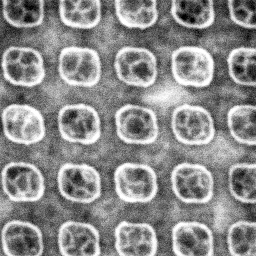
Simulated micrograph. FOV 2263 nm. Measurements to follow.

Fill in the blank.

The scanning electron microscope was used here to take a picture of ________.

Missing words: a regular array of raised bodies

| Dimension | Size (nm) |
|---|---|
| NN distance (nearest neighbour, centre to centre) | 499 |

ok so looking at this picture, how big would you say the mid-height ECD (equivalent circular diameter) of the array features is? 341 nanometers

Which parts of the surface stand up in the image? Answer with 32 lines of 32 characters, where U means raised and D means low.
DUUUUDDDUUUUDDDUUUUDDDUUUUDDDUUU
DUUUUDDDUUUUDDDUUUUDDDUUUUDDDUUU
DUUUUDDDUUUUDDDUUUUDDDUUUUDDDUUU
DDDDDDDDDDDDDDDDDDDDDDDDDDDDDDDD
DDDDDDDDDDDDDDDDDDDDDDDDDDDDDDDD
DDDDDDDDDDDDDDDDDDDDDDDDDDDDDDDD
DUUUDDDDUUUDDDDUUUDDDDUUUDDDDUUU
DUUUUDDDUUUUDDDUUUUDDDUUUUDDDUUU
DUUUUDDDUUUUDDDUUUUDDDUUUUDDDUUU
DUUUUDDDUUUUDDDUUUUDDDUUUUDDDUUU
DDDDDDDDDDUDDDDDDUUDDDDDUUDDDDDD
DDDDDDDDDDDDDDDDDDDDDDDDDDDDDDDD
DDDDDDDDDDDDDDDDDDDDDDDDDDDDDDDD
DUUUDDDDDUUDDDDDUDDDDDDDDDDDDDUU
DUUUUDDDUUUUDDDUUUUDDDUUUUDDDUUU
DUUUUDDDUUUUDDDUUUUDDDUUUUDDDUUU
DUUUUDDDUUUUDDDUUUUDDDUUUUUDDUUU
DDUUUDDDDUUUDDDDUUUDDDDUUUDDDDUU
DDDDDDDDDDDDDDDDDDDDDDDDDDDDDDDD
DDDDDDDDDDDDDDDDDDDDDDDDDDDDDDDD
DDDDDDDDDDDDDDDDDDDDDDDDDDDDDDDD
UUUUUDDDUUUUDDDUUUUDDDUUUUDDDUUU
UUUUUDDUUUUUDDDUUUUDDDUUUUDDDUUU
DUUUUDDDUUUUDDDUUUUDDDUUUUDDDUUU
DUUUUDDDUUUUDDDUUUUDDDUUUUDDDUUU
DDDDDDDDDDDDDDDDDDDDDDDDDDDDDDDD
DDDDDDDDDDDDDDDDDDDDDDDDDDDDDDDD
DDDDDDDDDDDDDDDDDDDDDDDDDDDDDDDD
DUUUDDDDUUUDDDDUUUUDDDUUUUDDDUUU
UUUUUDDDUUUUDDDUUUUDDDUUUUDDDUUU
DUUUUDDDUUUUDDDUUUUDDDUUUUDDDUUU
DUUUUDDDUUUUDDDUUUUDDDUUUUDDDUUU